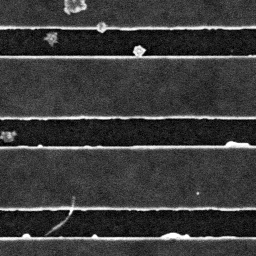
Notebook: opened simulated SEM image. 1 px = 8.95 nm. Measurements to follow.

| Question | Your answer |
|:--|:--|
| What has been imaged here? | lines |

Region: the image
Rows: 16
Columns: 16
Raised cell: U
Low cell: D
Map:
UUUUUUUUUUUUUUUU
UUUUUUUUUUUUUUUU
DDDDDDDDDDDDDDDD
DDDDDDDDUUDDDDDD
UUUUUUUUUUUUUUUU
UUUUUUUUUUUUUUUU
UUUUUUUUUUUUUUUU
DDDDDDDDDDDDDDDD
DDDDDDDDDDDDDDDD
UUUUUUUUUUUUUUUU
UUUUUUUUUUUUUUUU
UUUUUUUUUUUUUUUU
UUUUUUUUUUUUUUUU
DDDDDDDDDDDDDDDD
DDDDDDDDDDDDDDDD
UUUUUUUUUUUUUUUU